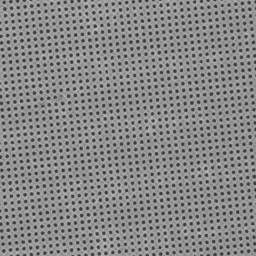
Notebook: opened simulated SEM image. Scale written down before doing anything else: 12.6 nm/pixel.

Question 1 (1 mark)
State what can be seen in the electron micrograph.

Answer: a regular array of holes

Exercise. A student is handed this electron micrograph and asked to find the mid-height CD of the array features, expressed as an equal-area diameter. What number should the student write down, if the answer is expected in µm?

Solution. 0.047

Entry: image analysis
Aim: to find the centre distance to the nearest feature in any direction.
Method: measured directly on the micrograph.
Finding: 80.2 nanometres